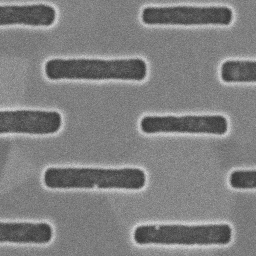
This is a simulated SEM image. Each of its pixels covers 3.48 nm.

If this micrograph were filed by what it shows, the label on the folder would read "holes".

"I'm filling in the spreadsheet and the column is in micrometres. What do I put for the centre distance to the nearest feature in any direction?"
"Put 0.365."